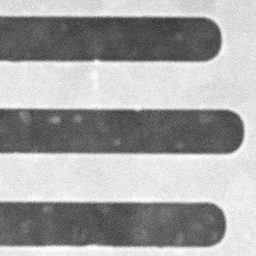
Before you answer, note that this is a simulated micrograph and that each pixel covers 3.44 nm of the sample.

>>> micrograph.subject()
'one or a few lines or trenches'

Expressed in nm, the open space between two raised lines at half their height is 164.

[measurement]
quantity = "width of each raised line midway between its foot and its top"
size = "157 nanometers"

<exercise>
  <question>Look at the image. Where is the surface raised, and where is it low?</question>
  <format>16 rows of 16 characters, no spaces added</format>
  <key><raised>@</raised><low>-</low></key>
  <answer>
@@@@@@@@@@@@@@@@
--------------@@
--------------@@
--------------@@
@@@@@@@@@@@@@@@@
@@@@@@@@@@@@@@@@
@@@@@@@@@@@@@@@@
---------------@
---------------@
---------------@
@@@@@@@@@@@@@@@@
@@@@@@@@@@@@@@@@
-@@@@@@@@@@@@@@@
--------------@@
--------------@@
@@@@@@@@-----@@@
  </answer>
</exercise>